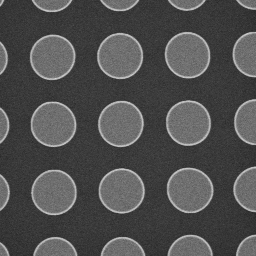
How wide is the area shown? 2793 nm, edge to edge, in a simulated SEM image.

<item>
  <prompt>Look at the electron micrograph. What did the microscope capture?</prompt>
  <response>an array of small figures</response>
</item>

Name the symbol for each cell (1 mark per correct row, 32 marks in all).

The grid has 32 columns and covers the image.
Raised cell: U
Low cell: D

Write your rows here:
DDDDUUUUUDDDDUUUUDDDDUUUUDDDDDUU
DDDDDDDDDDDDDDDDDDDDDDDDDDDDDDDD
DDDDDDDDDDDDDDDDDDDDDDDDDDDDDDDD
DDDDDDDDDDDDDDDDDDDDDDDDDDDDDDDD
DDDDDDUUDDDDDDUUDDDDDDUUUDDDDDUU
DDDDUUUUUDDDDUUUUDDDDUUUUUDDDUUU
UDDDUUUUUDDDUUUUUUDDDUUUUUDDDUUU
UDDDUUUUUDDDUUUUUUDDDUUUUUDDDUUU
UDDDUUUUUDDDDUUUUDDDDUUUUUDDDDUU
DDDDDUUUDDDDDDUUDDDDDDUUUDDDDDDU
DDDDDDDDDDDDDDDDDDDDDDDDDDDDDDDD
DDDDDDDDDDDDDDDDDDDDDDDDDDDDDDDD
DDDDDDDDDDDDDDDDDDDDDDDDDDDDDDDU
DDDDDUUUUDDDDUUUUDDDDUUUUUDDDDUU
UDDDUUUUUDDDDUUUUUDDDUUUUUDDDUUU
UDDDUUUUUUDDUUUUUUDDDUUUUUDDDUUU
UDDDUUUUUDDDUUUUUUDDDUUUUUDDDDUU
DDDDDUUUUDDDDUUUUDDDDDUUUDDDDDUU
DDDDDDDDDDDDDDDDDDDDDDDDDDDDDDDD
DDDDDDDDDDDDDDDDDDDDDDDDDDDDDDDD
DDDDDDDDDDDDDDDDDDDDDDDDDDDDDDDD
DDDDDDUUDDDDDDUUUDDDDDUUUDDDDDUU
UDDDUUUUUDDDDUUUUUDDDUUUUUDDDUUU
UDDDUUUUUDDDUUUUUUDDDUUUUUUDDUUU
UDDDUUUUUUDDUUUUUUDDDUUUUUUDDUUU
UDDDUUUUUDDDDUUUUUDDDDUUUUDDDDUU
DDDDDUUUDDDDDDUUDDDDDDDUUDDDDDDD
DDDDDDDDDDDDDDDDDDDDDDDDDDDDDDDD
DDDDDDDDDDDDDDDDDDDDDDDDDDDDDDDD
DDDDDDDDDDDDDDDDDDDDDDDUUDDDDDDU
DDDDDUUUUDDDDUUUUDDDDDUUUUDDDDUU
UDDDUUUUUDDDDUUUUUDDDUUUUUUDDDUU